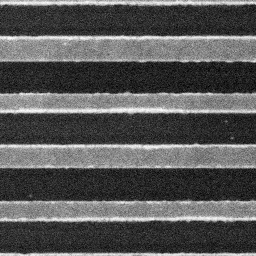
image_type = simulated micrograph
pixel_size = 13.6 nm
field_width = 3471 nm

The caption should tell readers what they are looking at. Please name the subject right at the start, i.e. lines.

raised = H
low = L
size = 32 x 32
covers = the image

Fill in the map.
LLLLLLLLLLLLLLLLLLLLLLLLLLLLLLLL
LLLLLLLLLLLLLLLLLLLLLLLLLLLLLLLL
LLLLLLLLLLLLLLLLLLLLLLLLLLLLLLLL
LLLLLLLLLLLLLLLLLLLLLLLLLLLLLLLL
LLLLLLLLLLLLLLLLLLLLLLLLLLLLLLLL
HHHHHHHHHHHHHHHHHHHHHHHHHHHHHHHH
HHHHHHHHHHHHHHHHHHHHHHHHHHHHHHHH
HHHHHHHHHHHHHHHHHHHHHHHHHHHHHHHH
LLLLLLLLLLLLLLLLLLLLLLLLLLLLLLLL
LLLLLLLLLLLLLLLLLLLLLLLLLLLLLLLL
LLLLLLLLLLLLLLLLLLLLLLLLLLLLLLLL
LLLLLLLLLLLLLLLLLLLLLLLLLLLLLLLL
HHHHHHHHHHHHHHHHHHHHHHHHHHHHHHHH
HHHHHHHHHHHHHHHHHHHHHHHHHHHHHHHH
LLLLLLLLLLLLLLLLLLLLLLLLLLLLLLLL
LLLLLLLLLLLLLLLLLLLLLLLLLLLLLLLL
LLLLLLLLLLLLLLLLLLLLLLLLLLLLLLLL
LLLLLLLLLLLLLLLLLLLLLLLLLLLLLLLL
HHHHHHHHHHHHHHHHHHHHHHHHHHHHHHHH
HHHHHHHHHHHHHHHHHHHHHHHHHHHHHHHH
HHHHHHHHHHHHHHHHHHHHHHHHHHHHHHHH
LLLLLLLLLLLLLLLLLLLLLLLLLLLLLLLL
LLLLLLLLLLLLLLLLLLLLLLLLLLLLLLLL
LLLLLLLLLLLLLLLLLLLLLLLLLLLLLLLL
LLLLLLLLLLLLLLLLLLLLLLLLLLLLLLLL
HHHHHHHHHHHHHHHHHHHHHHHHHHHHHHHH
HHHHHHHHHHHHHHHHHHHHHHHHHHHHHHHH
LLLLLLLLLLLLLLLLLLLLLLLLLLLLLLLL
LLLLLLLLLLLLLLLLLLLLLLLLLLLLLLLL
LLLLLLLLLLLLLLLLLLLLLLLLLLLLLLLL
LLLLLLLLLLLLLLLLLLLLLLLLLLLLLLLL
LLLLLLLLLLLLLLLLLLLLLLLLLLLLLLLL